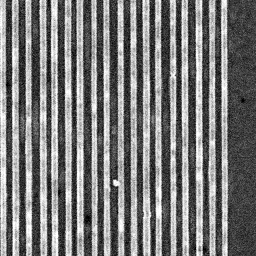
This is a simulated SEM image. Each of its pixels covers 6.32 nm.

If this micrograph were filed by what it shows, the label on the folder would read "parallel lines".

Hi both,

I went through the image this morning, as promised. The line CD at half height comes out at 0.0316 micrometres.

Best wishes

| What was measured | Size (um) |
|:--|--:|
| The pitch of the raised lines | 0.0825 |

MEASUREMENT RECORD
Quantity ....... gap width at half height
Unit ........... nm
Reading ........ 49